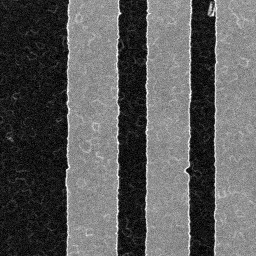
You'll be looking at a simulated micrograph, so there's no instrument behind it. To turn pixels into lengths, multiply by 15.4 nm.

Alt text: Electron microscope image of one or a few lines or trenches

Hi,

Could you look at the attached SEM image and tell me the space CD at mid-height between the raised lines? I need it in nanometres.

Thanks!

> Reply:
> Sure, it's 699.